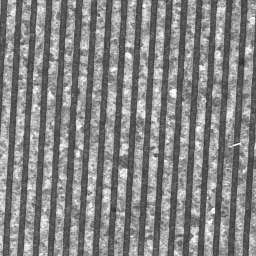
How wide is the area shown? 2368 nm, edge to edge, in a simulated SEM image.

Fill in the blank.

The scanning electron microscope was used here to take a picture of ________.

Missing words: parallel lines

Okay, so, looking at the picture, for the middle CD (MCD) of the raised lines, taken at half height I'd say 8.37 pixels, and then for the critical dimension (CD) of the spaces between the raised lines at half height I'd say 62.3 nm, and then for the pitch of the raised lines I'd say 138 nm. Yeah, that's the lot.